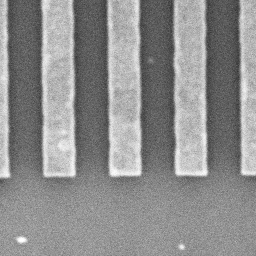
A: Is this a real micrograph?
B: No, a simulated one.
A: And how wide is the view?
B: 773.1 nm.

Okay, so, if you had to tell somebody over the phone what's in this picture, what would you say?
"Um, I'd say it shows wiring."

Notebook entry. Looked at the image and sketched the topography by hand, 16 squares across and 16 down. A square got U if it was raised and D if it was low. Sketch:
DDDUUDDUUDDUUDDU
DDDUUDDUUDDUUDDU
DDDUUDDUUDDUUDDU
DDDUUDDUUDDUUDDU
DDDUUDDUUDDUUDDU
DDDUUDDUUDDUUDDU
DDDUUDDUUDDUUDDU
DDDUUDDUUDDUUDDU
DDDUUDDUUDDUUDDU
DDDUUDDUUDDUUDDU
UDDUUDDUUDDUUDDU
DDDDDDDDDDDDDDDD
DDDDDDDDDDDDDDDD
DDDDDDDDDDDDDDDD
DDDDDDDDDDDDDDDD
DDDDDDDDDDDDDDDD